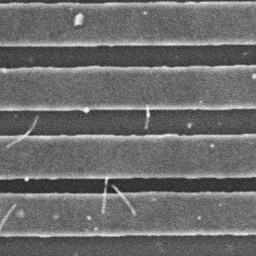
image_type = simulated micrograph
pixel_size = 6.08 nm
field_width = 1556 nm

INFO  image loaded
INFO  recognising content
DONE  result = lines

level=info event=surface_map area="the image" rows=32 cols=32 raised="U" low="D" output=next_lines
DUUDUUDUUUDDDUUUUUUUUUUUUUUUUUUU
UUUUUUUUUUUUUUUUUUUUUUUUUUUUUUUU
UUUUUUUUUUUUUUUUUUUUUUUUUUUUUUUU
UUUUUUUUUUUUUUUUUUUUUUUUUUUUUUUU
UUUUUUUUUUUUUUUUUUUUUUUUUUUUUUUU
UUUUUUUUUUUUUUUUUUUUUUUUUUDDDDDD
DDDDDDDDDDDDDDDDDDDDDDDDDDDDDDDD
DDDDDDDDDDDDDDDDDDDDDDDDDDDDDDDD
DDDDUUUDDUUUUUUUUUUUUDUUUUUUUUUU
UUUUUUUUUUUUUUUUUUUUUUUUUUUUUUUU
UUUUUUUUUUUUUUUUUUUUUUUUUUUUUUUU
UUUUUUUUUUUUUUUUUUUUUUUUUUUUUUUU
UUUUUUUUUUUUUUUUUUUUUUUUUUUUUUUU
UUUUUUUUUUUUUUUUUUUUUUUUUUUUUUUU
DDDDDDDDDDDDDDDDDDDDDDDDDDDDDDDD
DDDDDDDDDDDDDDDDDDDDDDDDDDDDDDDD
DDDDDDDDDDDDDDDDDDDDDDDDDDDDDDDD
UUUUUUUUUUUUUUUUUUUUUUUUUUUUUUUU
UUUUUUUUUUUUUUUUUUUUUUUUUUUUUUUU
UUUUUUUUUUUUUUUUUUUUUUUUUUUUUUUU
UUUUUUUUUUUUUUUUUUUUUUUUUUUUUUUU
UUUUUUUUUUUUUUUUUUUUUUUUUUUUUUUU
DDDDDDDDDDDDDDDDDDDDDDDDDDDDDDDD
DDDDDDDDDDDDDDDDDDDDDDDDDDDDDDDD
UUUUUUUUUUUUUUUUUUUUUUUUUUUUUUUU
UUUUUUUUUUUUUUUUUUUUUUUUUUUUUUUU
UUUUUUUUUUUUUUUUUUUUUUUUUUUUUUUU
UUUUUUUUUUUUUUUUUUUUUUUUUUUUUUUU
UUUUUUUUUUUUUUUUUUUUUUUUUUUUUUUU
DDDDDUDDDDDDDDDDDDDDDDDDDDDDDDDD
DDDDDDDDDDDDDDDDDDDDDDDDDDDDDDDD
DDDDDDDDDDDDDDDDDDDDDDDDDDDDDDDD